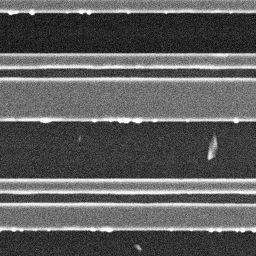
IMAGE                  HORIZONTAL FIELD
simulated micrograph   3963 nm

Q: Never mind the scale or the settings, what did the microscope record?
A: lines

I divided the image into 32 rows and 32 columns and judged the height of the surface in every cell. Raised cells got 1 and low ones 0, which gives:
11111111111111111111111111111111
11111111111111111111111011111111
00000000000000000000000000000000
00000000000000000000000000000000
00000000000000000000000000000000
00000000000000000000000000000000
00000000000000000000000000000000
11111111111111111111111111111111
11111111111111111111111111111111
11111111111111111111111111111111
11111111111111111111111111111111
11111111111111111111111111111111
11111111111111111111111111111111
11111111111111111111111111111111
11111111111111111111111111111111
00000000000000000000000000000000
00000000000000000000000000000000
00000000000000000000000000000000
00000000000000000000000000000000
00000000000000000000000000000000
00000000000000000000000000000000
00000000000000000000000000000000
00000000000000000100000000000000
11111111111111111111111111111111
11111111111111111111111111111111
11111111111111111111111111111111
11111111111111111111111111111111
11111111111111111111111111111111
11111111111111111111111111111111
00000000000000000000000000000000
00000000000000000000000000000000
00000000000000000000000000000000